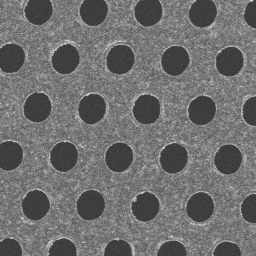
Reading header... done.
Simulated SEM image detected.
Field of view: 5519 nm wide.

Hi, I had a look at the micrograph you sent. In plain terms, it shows a regular array of holes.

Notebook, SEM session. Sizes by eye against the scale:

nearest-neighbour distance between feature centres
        1.18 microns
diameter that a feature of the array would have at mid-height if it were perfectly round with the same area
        627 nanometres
